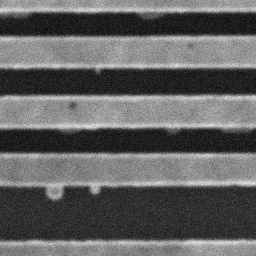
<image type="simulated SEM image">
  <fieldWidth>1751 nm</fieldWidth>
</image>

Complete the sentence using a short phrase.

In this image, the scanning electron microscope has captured lines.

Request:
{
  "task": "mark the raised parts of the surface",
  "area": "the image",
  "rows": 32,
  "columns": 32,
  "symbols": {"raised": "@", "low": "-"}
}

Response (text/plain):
@@@@@@@@@@@@@@@@@@@@@@@@@@@@@@@@
--------------------------------
--------------------------------
--------------------------------
--------------------------------
@@@@@@@@@@@@@@@@@@@@@@@@@@@@@@@@
@@@@@@@@@@@@@@@@@@@@@@@@@@@@@@@@
@@@@@@@@@@@@@@@@@@@@@@@@@@@@@@@@
-@@@-@@----@-----@--------------
--------------------------------
--------------------------------
--------------------------------
@@@@@@@@@@@@@@@@@@@@@@@@@@@@@@@@
@@@@@@@@@@@@@@@@@@@@@@@@@@@@@@@@
@@@@@@@@@@@@@@@@@@@@@@@@@@@@@@@@
@@@@@@@@@@@@@@@@@@@@@@@@@@@@@@@@
--------------------------------
--------------------------------
--------------------------------
@@@@@@@@@@@@@@@@@@@@@@@@@@@@@@@@
@@@@@@@@@@@@@@@@@@@@@@@@@@@@@@@@
@@@@@@@@@@@@@@@@@@@@@@@@@@@@@@@@
@@@@@@@@@@@@@@@@@@@@@@@@@@@@@@@@
--------------------------------
--------------------------------
--------------------------------
--------------------------------
--------------------------------
--------------------------------
--------------------------------
@@@@@@@@@@@@@@@@@@@@@@@@@@@@@@@@
@@@@@@@@@@@@@@@@@@@@@@@@@@@@@@@@